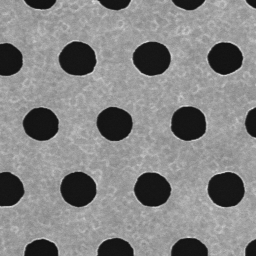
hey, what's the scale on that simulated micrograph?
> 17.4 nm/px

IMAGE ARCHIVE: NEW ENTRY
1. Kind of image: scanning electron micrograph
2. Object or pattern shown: a regular array of holes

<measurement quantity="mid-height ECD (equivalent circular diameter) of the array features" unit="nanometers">618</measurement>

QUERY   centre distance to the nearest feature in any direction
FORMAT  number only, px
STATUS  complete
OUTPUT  74